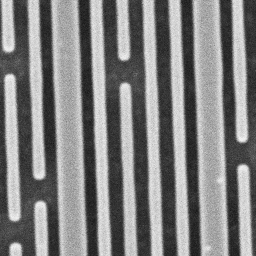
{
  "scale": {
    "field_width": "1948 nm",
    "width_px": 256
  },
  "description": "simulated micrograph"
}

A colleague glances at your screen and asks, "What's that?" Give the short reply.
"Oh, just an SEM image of groups of lines, slits or small figures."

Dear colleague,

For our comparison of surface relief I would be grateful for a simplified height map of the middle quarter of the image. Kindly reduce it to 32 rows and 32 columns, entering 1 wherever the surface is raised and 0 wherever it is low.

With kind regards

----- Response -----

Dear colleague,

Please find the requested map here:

11110001110000000000011000011000
11110001110000000000011000011000
11110001110000000000011000011000
11110001110000000000011000011100
11110001110000000000011000011100
11110001110000110000011000011100
11110001110000110000011000011100
11110000110000111000011000011100
11110000110000111000011000011100
11110000110000111000011000011100
11110000110000111000011000011100
11110000110000111000011000011100
11110000110000111000011000011100
11110000110000111000011000011100
11110000110000111000011000011100
11110000110000111000011000011100
11110000110000111000011000011100
11110000111000111000011000011100
11110000111000111000011000011100
11110000111000111000011000001100
11110000111000011000011000001100
11111000111000011000011100001100
11111000111000011000011100001100
11111000111000011000011100001100
11111000111000011000011100001100
11111000111000011000011100001100
11111000111000011000011100001100
11111000111000011000011100001100
11111000111000011000011100001100
11111000111000011000011100001100
11111000111000011000011100001100
11111000111000011100011100001110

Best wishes